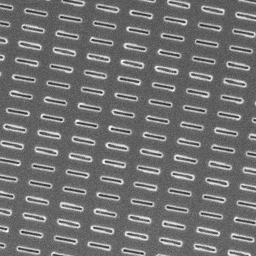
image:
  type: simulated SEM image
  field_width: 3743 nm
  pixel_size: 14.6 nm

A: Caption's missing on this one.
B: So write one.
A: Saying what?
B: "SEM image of a regular array of holes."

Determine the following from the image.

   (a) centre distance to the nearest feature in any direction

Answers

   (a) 244 nm